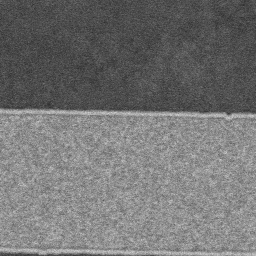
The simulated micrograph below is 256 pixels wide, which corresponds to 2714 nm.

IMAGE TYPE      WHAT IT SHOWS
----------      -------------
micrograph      one or a few lines or trenches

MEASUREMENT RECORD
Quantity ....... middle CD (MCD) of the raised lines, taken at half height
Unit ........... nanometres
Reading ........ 1460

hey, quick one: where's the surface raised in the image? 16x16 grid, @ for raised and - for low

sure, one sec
----------------
----------------
----------------
----------------
----------------
----------------
----------------
@@@@@@@@@@@@@@@@
@@@@@@@@@@@@@@@@
@@@@@@@@@@@@@@@@
@@@@@@@@@@@@@@@@
@@@@@@@@@@@@@@@@
@@@@@@@@@@@@@@@@
@@@@@@@@@@@@@@@@
@@@@@@@@@@@@@@@@
@@@@@@@@@@@@@@@@